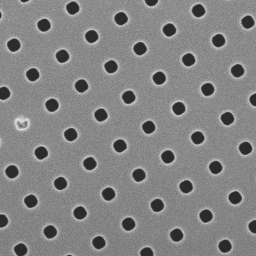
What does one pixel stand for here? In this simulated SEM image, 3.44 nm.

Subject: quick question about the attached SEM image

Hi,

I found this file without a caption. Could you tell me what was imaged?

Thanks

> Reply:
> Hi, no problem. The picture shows a regular array of holes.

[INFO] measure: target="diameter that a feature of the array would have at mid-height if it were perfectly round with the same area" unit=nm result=44.6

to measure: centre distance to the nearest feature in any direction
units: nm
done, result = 119